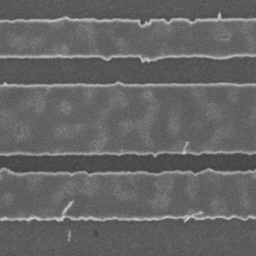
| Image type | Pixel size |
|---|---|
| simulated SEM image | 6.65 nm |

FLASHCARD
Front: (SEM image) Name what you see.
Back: one or a few lines or trenches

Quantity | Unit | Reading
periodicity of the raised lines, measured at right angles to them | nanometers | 523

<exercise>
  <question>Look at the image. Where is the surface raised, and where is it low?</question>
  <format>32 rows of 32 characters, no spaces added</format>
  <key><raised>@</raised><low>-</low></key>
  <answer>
--------------------------------
--------------------------------
-------@@@@@@@@@---@--@--@@@@@@@
@@@@@@@@@@@@@@@@@@@@@@@@@@@@@@@@
@@@@@@@@@@@@@@@@@@@@@@@@@@@@@@@@
@@@@@@@@@@@@@@@@@@@@@@@@@@@@@@@@
@@@@@@@@@@@@@@@@@@@@@@@@@@@@@@@@
------------------@-------------
--------------------------------
--------------------------------
--------------@------------@@---
@@@@@@@@@@@@@@@@@@@@@@@@@@@@@@@@
@@@@@@@@@@@@@@@@@@@@@@@@@@@@@@@@
@@@@@@@@@@@@@@@@@@@@@@@@@@@@@@@@
@@@@@@@@@@@@@@@@@@@@@@@@@@@@@@@@
@@@@@@@@@@@@@@@@@@@@@@@@@@@@@@@@
@@@@@@@@@@@@@@@@@@@@@@@@@@@@@@@@
@@@@@@@@@@@@@@@@@@@@@@@@@@@@@@@@
@@@@@@@@@@@@@@@@@@@@@@@@@@@@@@@@
--------------------------------
--------------------------------
@--------@@------@---@@@-@@----@
@@@@@@@@@@@@@@@@@@@@@@@@@@@@@@@@
@@@@@@@@@@@@@@@@@@@@@@@@@@@@@@@@
@@@@@@@@@@@@@@@@@@@@@@@@@@@@@@@@
@@@@@@@@@@@@@@@@@@@@@@@@@@@@@@@@
@@@@@@@@@@@@@@@@@@@@@@@@@@@@@@@@
-@---------------@--------------
--------------------------------
--------------------------------
--------------------------------
--------------------------------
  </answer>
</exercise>